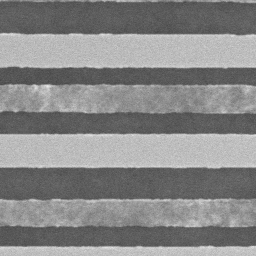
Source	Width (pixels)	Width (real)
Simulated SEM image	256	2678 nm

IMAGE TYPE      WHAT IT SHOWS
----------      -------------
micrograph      lines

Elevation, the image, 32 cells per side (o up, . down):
................................
................................
................................
................................
oooooooooooooooooooooooooooooooo
oooooooooooooooooooooooooooooooo
oooooooooooooooooooooooooooooooo
oooooooooooooooooooooooooooooooo
................................
................................
................................
oooooooooooooooooooooooooooooooo
oooooooooooooooooooooooooooooooo
oooooooooooooooooooooooooooooooo
................................
................................
................................
oooooooooooooooooooooooooooooooo
oooooooooooooooooooooooooooooooo
oooooooooooooooooooooooooooooooo
oooooooooooooooooooooooooooooooo
................................
................................
................................
................................
oooooooooooooooooooooooooooooooo
oooooooooooooooooooooooooooooooo
oooooooooooooooooooooooooooooooo
................................
................................
................................
oooooooooooooooooooooooooooooooo